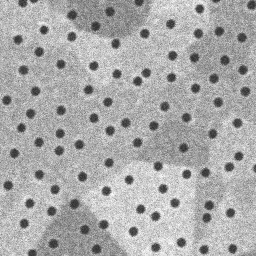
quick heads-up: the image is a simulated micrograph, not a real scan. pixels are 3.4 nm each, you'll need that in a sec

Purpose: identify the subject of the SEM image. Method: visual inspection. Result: a regular array of holes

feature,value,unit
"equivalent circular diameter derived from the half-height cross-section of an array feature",34.6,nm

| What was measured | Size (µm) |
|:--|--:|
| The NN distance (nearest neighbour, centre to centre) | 0.0755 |